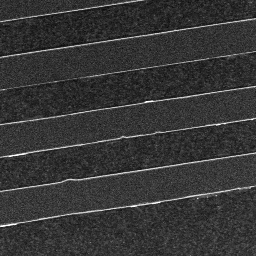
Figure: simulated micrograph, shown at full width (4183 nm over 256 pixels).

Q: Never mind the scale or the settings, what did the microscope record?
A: one or a few lines or trenches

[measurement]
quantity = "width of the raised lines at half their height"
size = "525 nanometers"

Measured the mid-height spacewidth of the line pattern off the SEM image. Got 568 nm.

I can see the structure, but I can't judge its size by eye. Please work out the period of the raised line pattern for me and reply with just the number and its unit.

1070 nanometres